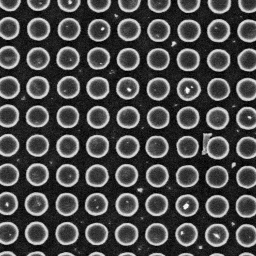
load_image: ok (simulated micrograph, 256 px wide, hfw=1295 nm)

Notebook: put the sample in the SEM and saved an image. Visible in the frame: a regular array of raised bodies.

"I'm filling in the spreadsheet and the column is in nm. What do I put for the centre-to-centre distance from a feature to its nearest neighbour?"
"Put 147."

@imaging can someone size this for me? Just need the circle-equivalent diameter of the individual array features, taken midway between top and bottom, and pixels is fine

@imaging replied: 21.6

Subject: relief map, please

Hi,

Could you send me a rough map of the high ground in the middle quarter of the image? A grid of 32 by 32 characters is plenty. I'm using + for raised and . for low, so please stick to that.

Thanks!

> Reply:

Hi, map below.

+++....+++....++++....++++...+++
..............................++
................................
+++.....++......................
++++..+++++...++++....++++...+++
++++..+++++..++++++..+++++...+++
++++..+++++..++++++..+++++...+++
+++...+++++...++++...+++++...+++
.......++......++.....+++.....++
................................
................................
+++....+++....++++....+++....+++
+++...+++++...+++++..+++++..++++
+++...+++++..++++++..+++++..++++
+++...+++++...++++...+++++...+++
++.....+++....++++....+++....+++
................................
................................
+++....+++....++++....+++.....++
+++...+++++..++++++..+++++...+++
+++...+++++..++++++..+++++..++++
+++...+++++..+++++...+++++..++++
+++...++++....++++...++++....+++
................................
................................
++.....++.....+++......+........
+++...++++...+++++...++++....+++
++++..+++++..+++++...+++++..++++
++++..+++++..+++++...+++++..++++
+++...++++....++++...++++....+++
++....................++......+.
................................